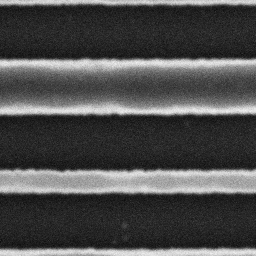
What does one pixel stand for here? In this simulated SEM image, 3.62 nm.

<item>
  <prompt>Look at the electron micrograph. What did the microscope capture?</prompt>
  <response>lines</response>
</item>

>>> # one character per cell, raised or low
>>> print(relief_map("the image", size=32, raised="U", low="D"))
DDDDDDDDDDDDDUUDDDDDDDUDDDDDDDDD
DDDDDDDDDDDDDDDDDDDDDDDDDDDDDDDD
DDDDDDDDDDDDDDDDDDDDDDDDDDDDDDDD
DDDDDDDDDDDDDDDDDDDDDDDDDDDDDDDD
DDDDDDDDDDDDDDDDDDDDDDDDDDDDDDDD
DDDDDDDDDDDDDDDDDDDDDDDDDDDDDDDD
DDDDDDDDDDDDDDDDDDDDDDDDDDDDDDDD
DDDDDDDDDDDDDDDDDDDDDDDDDDDDDDDD
UUUUUUUUUUUUUUUUUUUUUUUUUUUUUUUU
UUUUUUUUUUUUUUUUUUUUUUUUUUUUUUUU
UUUUUUUUUUUUUUUUUUUUUUUUUUUUUUUU
UUUUUUUUUUUUUUUUUUUUUUUUUUUUUUUU
UUUUUUUUUUUUUUUUUUUUUUUUUUUUUUUU
UUUUUUUUUUUUUUUUUUUUUUUUUUUUUUUU
DDDDDDDDDDDDDDDDDDDDDDDDDDDDDDDD
DDDDDDDDDDDDDDDDDDDDDDDDDDDDDDDD
DDDDDDDDDDDDDDDDDDDDDDDDDDDDDDDD
DDDDDDDDDDDDDDDDDDDDDDDDDDDDDDDD
DDDDDDDDDDDDDDDDDDDDDDDDDDDDDDDD
DDDDDDDDDDDDDDDDDDDDDDDDDDDDDDDD
DDDDDDDDDDDDDDDDDDDDDDDDDDDDDDDD
UUUUUUUDUUUUUDDDDUDUUUUUUDUUUUUU
UUUUUUUUUUUUUUUUUUUUUUUUUUUUUUUU
UUUUUUUUUUUUUUUUUUUUUUUUUUUUUUUU
DDDDDDDDDDDDDDDDDDDDDDDDDDDDDDDD
DDDDDDDDDDDDDDDDDDDDDDDDDDDDDDDD
DDDDDDDDDDDDDDDDDDDDDDDDDDDDDDDD
DDDDDDDDDDDDDDDDDDDDDDDDDDDDDDDD
DDDDDDDDDDDDDDDDDDDDDDDDDDDDDDDD
DDDDDDDDDDDDDDDDDDDDDDDDDDDDDDDD
DDDDDDDDDDDDDDDDDDDDDDDDDDDDDDDD
UUUUUUUUUUUUUUUUUUUDDUUUUUUUUUUU